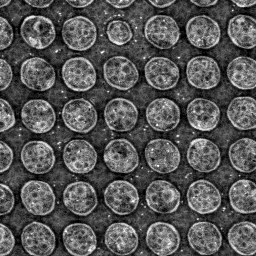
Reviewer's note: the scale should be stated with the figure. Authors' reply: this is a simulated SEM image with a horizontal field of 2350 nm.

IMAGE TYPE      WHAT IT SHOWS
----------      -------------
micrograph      a regular array of raised bodies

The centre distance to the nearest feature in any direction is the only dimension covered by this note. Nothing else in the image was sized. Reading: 375 nm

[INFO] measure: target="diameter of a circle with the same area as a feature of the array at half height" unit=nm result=301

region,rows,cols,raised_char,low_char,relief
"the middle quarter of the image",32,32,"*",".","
*******...********..********...*
*******...********..********...*
********..********..*********..*
********..********...*******...*
********...*******...*******....
.******......****.....*****.....
................................
................................
................................
.*****......****......*****.....
*******....*******...*******...*
********..********...*******...*
********..********...********..*
********..********...********..*
********...*******...********..*
.******.....*****.....******....
..****.......***........***.....
................................
................................
..****......****......*****.....
.******....******....*******....
********..********..********...*
********..********..*********..*
********..********...*****..*..*
********..********...********..*
.******....*******....******....
..*****.....*****......****.....
................................
................................
.............**.......****......
.*****.....******....******.....
*******...********...*******...*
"